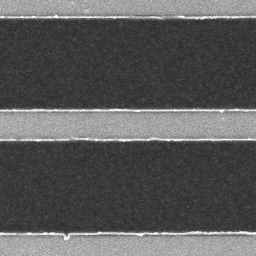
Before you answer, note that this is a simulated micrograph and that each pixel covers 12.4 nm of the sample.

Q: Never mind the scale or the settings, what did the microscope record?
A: one or a few lines or trenches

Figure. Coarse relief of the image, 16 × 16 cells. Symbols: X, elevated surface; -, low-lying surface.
----------------
XXXXXXXXXXXXXXXX
XXXXXXXXXXXXXXXX
XXXXXXXXXXXXXXXX
XXXXXXXXXXXXXXXX
XXXXXXXXXXXXXXXX
XXXXXXXXXXXXXXXX
----------------
----------------
XXXXXXXXXXXXXXXX
XXXXXXXXXXXXXXXX
XXXXXXXXXXXXXXXX
XXXXXXXXXXXXXXXX
XXXXXXXXXXXXXXXX
XXXXXXXXXXXXXXXX
----------------